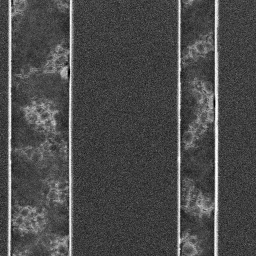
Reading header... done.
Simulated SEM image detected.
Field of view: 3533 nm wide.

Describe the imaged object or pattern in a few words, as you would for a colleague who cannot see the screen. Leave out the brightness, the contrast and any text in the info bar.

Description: one or a few lines or trenches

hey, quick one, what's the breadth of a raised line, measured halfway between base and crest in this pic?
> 1.51 micrometres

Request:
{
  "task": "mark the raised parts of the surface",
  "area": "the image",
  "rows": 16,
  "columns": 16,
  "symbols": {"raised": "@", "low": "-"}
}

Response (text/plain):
@---@@@@@@@--@@@
@---@@@@@@@--@@@
@---@@@@@@@--@@@
@---@@@@@@@--@@@
@---@@@@@@@--@@@
@---@@@@@@@--@@@
@---@@@@@@@---@@
@---@@@@@@@---@@
@---@@@@@@@---@@
@---@@@@@@@---@@
@---@@@@@@@---@@
@---@@@@@@@---@@
@---@@@@@@@--@@@
@---@@@@@@@--@@@
@---@@@@@@@--@@@
@---@@@@@@@--@@@